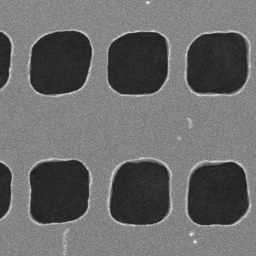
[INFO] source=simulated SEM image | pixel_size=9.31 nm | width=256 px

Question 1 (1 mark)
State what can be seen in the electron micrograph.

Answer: holes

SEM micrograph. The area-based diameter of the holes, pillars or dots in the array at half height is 613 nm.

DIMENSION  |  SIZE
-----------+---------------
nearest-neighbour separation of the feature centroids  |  726 nanometres